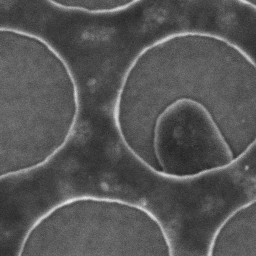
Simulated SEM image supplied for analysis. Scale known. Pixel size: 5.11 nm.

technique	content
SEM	holes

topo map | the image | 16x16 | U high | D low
UUUUUDDUUUUUUUUU
UUUUUUUUUUUUUUUU
DDUUUUUUUUDDDDUU
DDDDUUUUUDDDDDDU
DDDDUUUUDDDDDDDD
DDDDDUUUDDDDDDDD
DDDDDUUDDDDDDDDD
DDDDDUUDDDDDDDDD
DDDDUUUUDDDDDDDD
DDDUUUUUDDDDDDDU
DDUUUUUUUUDDDUUU
UUUUUUUUUUUUUUUU
UUUUUDUUUUUUUUUU
UUUDDDDDDUUUUUUD
UUDDDDDDDDUUUUDD
UDDDDDDDDDDUUDDD